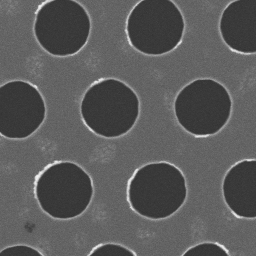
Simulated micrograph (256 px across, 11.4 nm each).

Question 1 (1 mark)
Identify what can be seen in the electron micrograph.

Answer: holes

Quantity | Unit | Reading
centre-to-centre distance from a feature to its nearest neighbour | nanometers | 1060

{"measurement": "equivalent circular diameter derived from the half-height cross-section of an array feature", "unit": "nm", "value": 635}